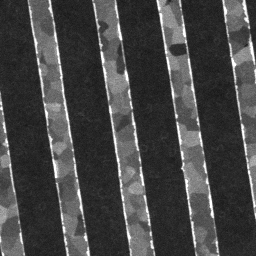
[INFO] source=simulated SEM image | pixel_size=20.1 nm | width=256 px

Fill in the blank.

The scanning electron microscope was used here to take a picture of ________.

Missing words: one or a few lines or trenches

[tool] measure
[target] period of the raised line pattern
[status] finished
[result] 1290 nm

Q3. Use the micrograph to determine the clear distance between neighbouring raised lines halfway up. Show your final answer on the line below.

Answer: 836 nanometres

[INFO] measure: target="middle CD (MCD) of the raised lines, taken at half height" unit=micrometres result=0.454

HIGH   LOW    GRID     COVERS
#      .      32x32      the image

....##......###.......#.....###.
....###.....###.....###.....###.
....###.....###.....###.....###.
....###.....###.....###.....###.
....###.....###.....###.....###.
....###.....###......##......#..
.....##......##......###.....###
.....##......###.....###.....###
.....###.....###.....###.....###
.....###.....###.....###.....###
.....###.....###.....###.....###
.....###.....###.....###......##
.....###......##......##......##
......##......###.....###.....##
......##......###.....###.....##
#.....###.....###.....###.....##
#.....###.....###.....###.....##
#.....###.....###.....###.....##
#.....###.....###......##......#
#......##......##......###.....#
#......##......###.....###.....#
#......###.....###.....###.....#
##.....###.....###.....###.....#
##.....###.....###.....###.....#
##.....###.....###.....###......
##.....###.....###......##......
##......##......###.....###.....
##......###.....###.....###.....
###.....###.....###.....###.....
###.....###.....###.....###.....
###.....###.....###.....###.....
###.....###.....###.....###.....